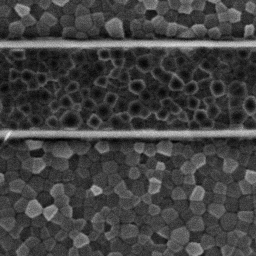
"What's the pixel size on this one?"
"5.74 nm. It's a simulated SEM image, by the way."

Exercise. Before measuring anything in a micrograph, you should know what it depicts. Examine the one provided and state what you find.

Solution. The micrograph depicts one or a few lines or trenches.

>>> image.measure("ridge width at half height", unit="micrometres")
0.519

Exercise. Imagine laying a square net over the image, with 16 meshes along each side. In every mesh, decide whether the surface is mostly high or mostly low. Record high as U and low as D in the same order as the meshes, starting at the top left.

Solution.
DDDDDDDDDDDDDDDD
DDDDDDDDDDDDDDDD
DDDDDDDDDDDDDDDD
UUUUUUUUUUUUUUUU
UUUUUUUUUUUUUUUU
UUUUUUUUUUUUUUUU
UUUUUUUUUUUUUUUU
UUUUUUUUUUUUUUUU
DDDDDDDDDDDDDDDD
DDDDDDDDDDDDDDDD
DDDDDDDDDDDDDDDD
DDDDDDDDDDDDDDDD
DDDDDDDDDDDDDDDD
DDDDDDDDDDDDDDDD
DDDDDDDDDDDDDDDD
DDDDDDDDDDDDDDDD